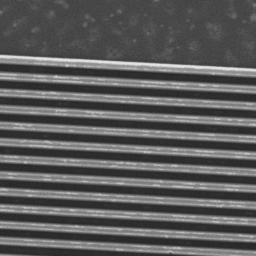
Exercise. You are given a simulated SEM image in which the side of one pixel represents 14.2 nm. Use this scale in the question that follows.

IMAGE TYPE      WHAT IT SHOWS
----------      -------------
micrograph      parallel lines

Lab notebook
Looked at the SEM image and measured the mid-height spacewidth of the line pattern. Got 0.141 um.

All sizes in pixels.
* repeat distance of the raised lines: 16.5